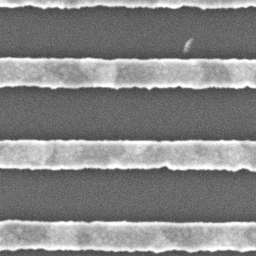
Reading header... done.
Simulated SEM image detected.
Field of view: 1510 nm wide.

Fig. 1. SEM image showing lines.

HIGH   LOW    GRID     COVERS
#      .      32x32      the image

################################
................................
................................
................................
................................
................................
................................
#############..##..#.##.##.#.#..
################################
################################
################################
................................
................................
................................
................................
................................
................................
................................
################################
################################
################################
................................
................................
................................
................................
................................
................................
................................
################################
################################
################################
................................